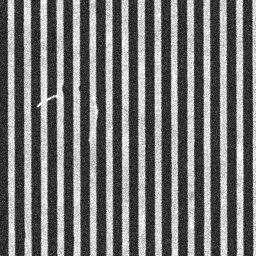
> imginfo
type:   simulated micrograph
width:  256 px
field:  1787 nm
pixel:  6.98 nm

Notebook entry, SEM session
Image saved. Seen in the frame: parallel lines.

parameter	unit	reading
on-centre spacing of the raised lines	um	0.114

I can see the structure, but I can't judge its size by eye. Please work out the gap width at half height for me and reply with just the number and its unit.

72.4 nm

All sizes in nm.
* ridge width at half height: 42.8